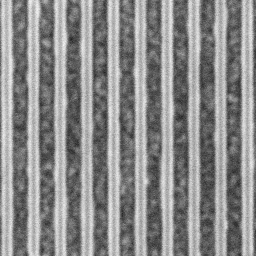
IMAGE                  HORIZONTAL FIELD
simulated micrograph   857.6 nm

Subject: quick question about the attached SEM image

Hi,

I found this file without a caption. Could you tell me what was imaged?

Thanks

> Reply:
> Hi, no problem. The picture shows parallel lines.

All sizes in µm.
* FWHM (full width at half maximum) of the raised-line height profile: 0.0323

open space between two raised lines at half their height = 0.0553 micrometres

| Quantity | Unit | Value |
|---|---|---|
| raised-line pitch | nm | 89.6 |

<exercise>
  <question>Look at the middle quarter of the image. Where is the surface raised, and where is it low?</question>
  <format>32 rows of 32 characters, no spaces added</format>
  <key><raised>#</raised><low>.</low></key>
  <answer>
.....##....##.....##.....##....#
.....##....##.....##.....##....#
.....##....##.....##.....##....#
.....##....##.....##.....##....#
.....##....##.....##.....##....#
.....##....##.....##.....##....#
.....##....##.....##.....##....#
.....##....##.....##.....##....#
.....##....##.....##.....##....#
.....##....##.....##.....##....#
.....##....##.....##.....##....#
.....##....##.....##.....##....#
.....##....##.....##.....##....#
.....##....##.....##.....##....#
.....##....##.....##.....##....#
.....##....###....##.....##....#
.....##....###....##.....##....#
.....##....###....##.....##....#
....###....###....##.....##....#
....###....###....##.....##....#
.....##....###....##.....##....#
.....##....###....##.....##....#
.....##....###....##.....##....#
.....##....###....##.....##.....
.....##....###....##.....##....#
.....##....###....##.....##....#
.....##....###....##.....##....#
.....##....###....##.....##....#
.....##....###....##.....##....#
.....##....###....###....##....#
.....##....###....##.....##....#
.....##....###....##.....##....#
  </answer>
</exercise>